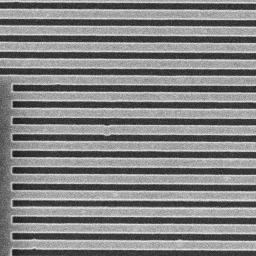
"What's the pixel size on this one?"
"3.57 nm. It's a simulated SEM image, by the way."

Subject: parallel lines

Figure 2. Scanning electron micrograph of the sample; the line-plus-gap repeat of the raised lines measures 58.9 nanometres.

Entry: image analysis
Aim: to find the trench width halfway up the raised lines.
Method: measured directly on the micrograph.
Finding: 25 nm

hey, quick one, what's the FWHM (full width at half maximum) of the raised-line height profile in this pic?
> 32.2 nm